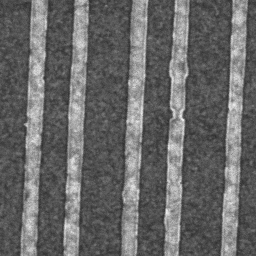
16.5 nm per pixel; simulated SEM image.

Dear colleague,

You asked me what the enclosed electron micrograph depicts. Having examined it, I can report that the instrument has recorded parallel lines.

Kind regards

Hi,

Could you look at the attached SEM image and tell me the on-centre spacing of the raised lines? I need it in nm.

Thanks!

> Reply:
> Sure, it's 826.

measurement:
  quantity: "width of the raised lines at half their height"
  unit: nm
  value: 219